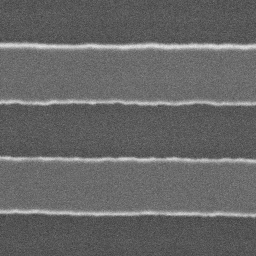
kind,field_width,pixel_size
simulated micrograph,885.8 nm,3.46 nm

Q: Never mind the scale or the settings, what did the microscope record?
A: lines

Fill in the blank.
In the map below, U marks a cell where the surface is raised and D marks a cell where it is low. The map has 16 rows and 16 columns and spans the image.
DDDDDDDDDDDDDDDD
DDDDDDDDDDDDDDDD
DDDDDDDDDDDDDDDD
UUUUUUUUUUUUUUUU
UUUUUUUUUUUUUUUU
UUUUUUUUUUUUUUUU
DDUDDDDDDUUUDUUU
DDDDDDDDDDDDDDDD
DDDDDDDDDDDDDDDD
DDDDDDDDDDDDDDDD
UUUUUUUUUUUUUUUU
UUUUUUUUUUUUUUUU
UUUUUUUUUUUUUUUU
DDDDDDDDDDDDDDDD
DDDDDDDDDDDDDDDD
DDDDDDDDDDDDDDDD